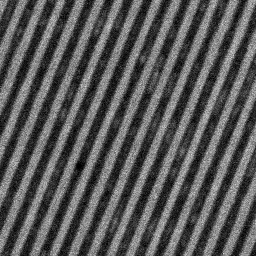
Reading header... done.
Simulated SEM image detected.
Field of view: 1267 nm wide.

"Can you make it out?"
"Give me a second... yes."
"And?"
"parallel lines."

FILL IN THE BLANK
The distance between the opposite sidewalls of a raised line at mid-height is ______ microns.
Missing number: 0.0378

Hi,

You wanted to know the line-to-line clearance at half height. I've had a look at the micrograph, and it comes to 52.1 nm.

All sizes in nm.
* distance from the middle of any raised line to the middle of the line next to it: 87.8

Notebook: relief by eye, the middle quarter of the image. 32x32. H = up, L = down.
LHHLLLHHLLLHHLLHHLLLHHLLLHHLLLHH
LHHLLLHHLLHHLLLHHLLLHHLLLHHLLHHH
HHLLLHHLLLHHLLLHHLLLHHLLHHLLLHHL
HHLLLHHLLLHHLLHHLLLHHLHLHHLLLHHL
HHLLHHLLLHHLLLHHLLLHHLHLHHLLHHLL
HLLLHHLLLHHLLHHLLLHHLLLHHLLLHHLL
HLLHHLLLHHLLLHHLLLHHLLLHHLLHHLLL
LLLHHLLLHHLLLHHLLLHHLLHHLLLHHLLL
LLLHHLLLHHLLHHLLLHHLLLHHLLLHHLLL
LLHHLLLHHLLLHHLLLHHLLLHHLLHHLLLH
LLHHLLLHHLLHHLLLHHLLLHHLLLHHLLLH
LHHLLLHHLLLHHLLLHHLLLHHLLHHLLLHH
LHHLLLHHLLLHHLLHHLLLHHLLLHHLLLHH
LHHLLLHHLLHHLLLHHLLLHHLLLHHLLLHH
HHLLLHHLLLHHLLLHHLLLHHLLHHLLLHHL
HHLLLHHLLHHLLLHHLLLHHLLLHHLLLHHL
HLLLHHLLLHHLLLHHLLLHHLLHHLLLHHLL
HLLLHHLLLHHLLHHLLLHHLLLHHLLLHHLL
HLLHHLLLHHLLLHHLLLHHLLLHHLLHHLLL
LLLHHLLLHHLLLHHLLLHHLLHHLLLHHLLL
LLLHHLLHHLLLHHLLLHHLLLHHLLLHHLLL
LLHHLLLHHLLLHHLLLHHLLHHLLLHHLHLH
LLHHLLHHHLLHHLLLHHLLLHHLLLHHLLLH
LHHLLLHHLLLHHLLLHHLLLHHLLHHLLLHH
LHHLLLHHLLLHHLLHHLLLHHLLLHHLLLHH
LHHLLHHLLLHHLLLHHLLLHHLLLHHLLLHL
HHLLLHHLLLHHLLLHHLLHHLLLHHLLLHHL
HHLLHHLLLHHLLLHHLLLHHLLLHHLLLHLL
HLLLHHLLLHHLLLHHLLHHHLLHHLLLHHLL
HLLLHHLLLHHLLHHLLLHHLLLHHLLLHHLL
HLLHHLLLHHLLLHHLLLHHLLLHHLLHHLLL
LLLHHLLLHHLLLHHLLHHLLLHHLLLHHLLL